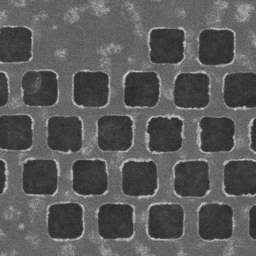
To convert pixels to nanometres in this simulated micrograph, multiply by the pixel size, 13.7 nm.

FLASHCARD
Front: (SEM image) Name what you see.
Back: a regular array of holes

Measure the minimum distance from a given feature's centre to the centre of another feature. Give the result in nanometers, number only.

684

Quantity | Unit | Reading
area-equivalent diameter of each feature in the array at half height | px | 38.6